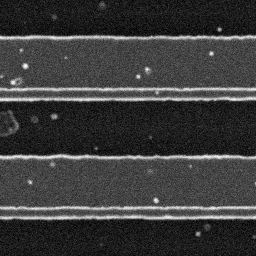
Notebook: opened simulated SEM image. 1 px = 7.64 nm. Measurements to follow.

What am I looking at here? lines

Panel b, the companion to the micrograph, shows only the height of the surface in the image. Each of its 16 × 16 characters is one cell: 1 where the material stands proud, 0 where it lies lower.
0000000000000000
0000000000000000
1111111111111111
1111111111111111
1111111111111111
1111111111111111
0000000000000000
0000000000000000
0000000000000000
0000000000000000
1111111111111111
1111111111111111
1111111111111111
1111111111111111
0000000000000000
0000000000000000